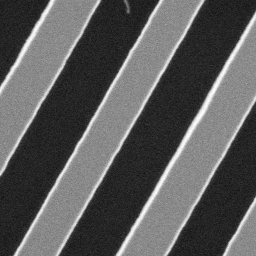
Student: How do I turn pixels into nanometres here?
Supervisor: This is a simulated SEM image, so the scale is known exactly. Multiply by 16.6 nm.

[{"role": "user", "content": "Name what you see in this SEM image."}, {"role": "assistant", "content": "lines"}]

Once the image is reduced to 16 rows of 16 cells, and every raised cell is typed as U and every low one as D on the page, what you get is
DDDUUUDDDDUUDDDD
DDUUUDDDDUUUDDDD
DDUUUDDDDUUDDDDU
DUUUDDDDUUUDDDUU
DUUUDDDUUUDDDDUU
UUUDDDDUUUDDDUUU
UUUDDDUUUDDDDUUU
UUDDDDUUDDDDUUUD
UDDDDUUUDDDDUUUD
UDDDDUUDDDDUUUDD
DDDDUUUDDDUUUUDD
DDDUUUDDDDUUUDDD
DDDUUUDDDUUUDDDD
DDUUUDDDDUUUDDDU
DDUUDDDDUUUDDDDU
DUUUDDDDUUUDDDUU